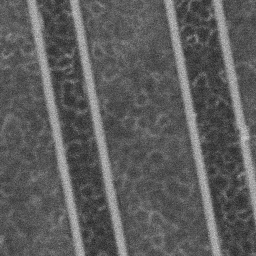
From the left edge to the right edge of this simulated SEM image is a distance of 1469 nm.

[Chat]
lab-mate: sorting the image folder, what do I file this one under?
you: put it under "one or a few lines or trenches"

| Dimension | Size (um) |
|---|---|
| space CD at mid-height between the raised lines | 0.532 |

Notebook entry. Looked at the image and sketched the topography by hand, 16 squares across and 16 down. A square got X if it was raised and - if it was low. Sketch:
--XXX------XXX--
--XXX------XXX--
--XXX------XXX--
---XX------XXX--
---XX------XXX--
---XXX------XXX-
---XXX------XXX-
---XXX------XXX-
----XX------XXX-
----XX------XXX-
----XXX-----XXXX
----XXX------XXX
----XXX------XXX
-----XX------XXX
-----XX------XXX
-----XXX-----XXX